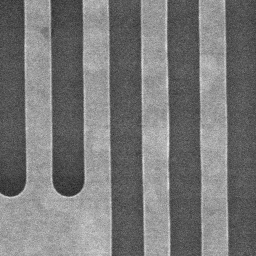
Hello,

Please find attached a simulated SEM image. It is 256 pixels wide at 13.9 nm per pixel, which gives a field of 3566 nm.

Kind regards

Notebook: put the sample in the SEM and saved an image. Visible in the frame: groups of lines, slits or small figures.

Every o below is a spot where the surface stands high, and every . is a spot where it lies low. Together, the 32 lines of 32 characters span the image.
...ooo....ooo.....ooo....ooo....
...ooo....oooo....ooo....ooo....
...ooo....oooo....ooo....ooo....
...ooo....oooo....ooo....ooo....
...ooo....oooo....ooo....ooo....
...ooo....oooo....ooo....ooo....
...ooo....oooo....ooo....ooo....
...ooo....oooo....ooo....ooo....
...ooo....oooo....ooo....ooo....
...ooo....oooo....ooo....ooo....
...ooo....oooo....ooo....ooo....
...ooo....oooo....ooo....ooo....
...ooo.....ooo....ooo....ooo....
...ooo.....ooo....ooo....ooo....
...ooo.....ooo....ooo....ooo....
...ooo.....ooo....ooo....ooo....
...ooo.....ooo....ooo....ooo....
...ooo.....ooo....ooo....ooo....
...ooo.....ooo....ooo....ooo....
...ooo.....ooo....ooo....ooo....
...ooo.....ooo....ooo....ooo....
...ooo.....ooo....ooo....ooo....
...oooo....ooo....ooo....ooo....
...oooo...oooo....ooo....ooo....
o.oooooo.ooooo....ooo....ooo....
oooooooooooooo....ooo....ooo....
oooooooooooooo....ooo....ooo....
oooooooooooooo....ooo....ooo....
oooooooooooooo....ooo....ooo....
oooooooooooooo....ooo....ooo....
oooooooooooooo....ooo....ooo....
oooooooooooooo....ooo....ooo....